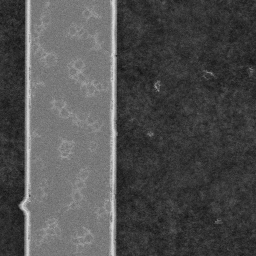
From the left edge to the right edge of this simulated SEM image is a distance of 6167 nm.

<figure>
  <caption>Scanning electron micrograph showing one or a few lines or trenches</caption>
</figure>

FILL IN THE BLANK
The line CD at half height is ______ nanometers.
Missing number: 2050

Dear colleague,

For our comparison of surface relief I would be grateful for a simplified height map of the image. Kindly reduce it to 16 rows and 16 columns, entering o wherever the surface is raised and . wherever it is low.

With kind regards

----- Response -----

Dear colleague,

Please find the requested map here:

..ooooo.........
..ooooo.........
..ooooo.........
..ooooo.........
..ooooo.........
..ooooo.........
..ooooo.........
..ooooo.........
..ooooo.........
..ooooo.........
..ooooo.........
..ooooo.........
..ooooo.........
..ooooo.........
..ooooo.........
..ooooo.........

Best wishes